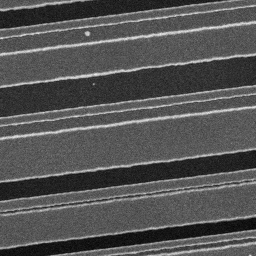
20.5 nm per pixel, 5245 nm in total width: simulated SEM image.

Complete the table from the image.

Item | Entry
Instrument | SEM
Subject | lines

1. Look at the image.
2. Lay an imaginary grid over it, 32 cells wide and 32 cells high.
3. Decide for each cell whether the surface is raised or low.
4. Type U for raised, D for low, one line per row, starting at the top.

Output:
UUUUUUDDDDDDDDDDDDDDDDDDDUUUUUUU
DDDDDDDDDDDDDDDDDUUUUUUUUUUUUUUU
DDDDDDDDDUUUUUUUUUUUUUUUUUUUUUUU
DDUUUUUUUUUUUUUUUUUUUUUUUUUUUUUU
UUUUUUUUUUUUUUUUUUUUUUUUUUUUUUUU
UUUUUUUUUUUUUUUUUUUUUUUUUUUUUUUU
UUUUUUUUUUUUUUUUUUUUUUUUUUUUUUUU
UUUUUUUUUUUUUUUUUUUUUUUUUUUDDDDD
UUUUUUUUUUUUUUUUUUDDDDDDDDDDDDDD
UUUUUUUUUUUDDDDDDDDDDDDDDDDDDDDD
UUUDDDDDDDDDDDDDDDDDDDDDDDDDDDDD
DDDDDDDDDDDDDDDDDDDDDDDDDUUUUUUU
DDDDDDDDDDDDDDDDDDUUUUUUUUUUUUUU
DDDDDDDDDDUUUUUUUUUUUUUUUUUUUUUU
DDUUUUUUUUUUUUUUUUUUUUUUUUUUUUUU
UUUUUUUUUUUUUUUUUUUUUUUUUUUUUUUU
UUUUUUUUUUUUUUUUUUUUUUUUUUUUUUUU
UUUUUUUUUUUUUUUUUUUUUUUUUUUUUUUU
UUUUUUUUUUUUUUUUUUUUUUUUUUUUUUUU
UUUUUUUUUUUUUUUUUUUUUUUUUUDDDDDD
UUUUUUUUUUUUUUUUUUDDDDDDDDDDDDDD
UUUUUUUUUUDDDDDDDDDDDDDDDDDDDUUU
UUUDDDDDDDDDDDDDDDDDDUUUUUUUUUUU
DDDDDDDDDDDDDUUUUUUUUUUUUUUUUUUU
DDDDDUUUUUUUUUUUUUUUUUUUUUUUUUUU
UUUUUUUUUUUUUUUUUUUUUUUUUUUUUUUU
UUUUUUUUUUUUUUUUUUUUUUUUUUUUUUUU
UUUUUUUUUUUUUUUUUUUUUUUUUUUUDDDD
UUUUUUUUUUUUUUUUUUUUDDDDDDDDDDDD
UUUUUUUUUUUUDDDDDDDDDDDDDDUUUUUU
UUUUUDDDDDDDDDDDDDUUUUUUUUUUUUUU
DDDDDDDDDDUUUUUUUUUUUUUUUUUUUUUU